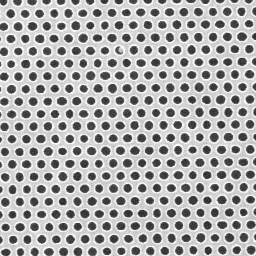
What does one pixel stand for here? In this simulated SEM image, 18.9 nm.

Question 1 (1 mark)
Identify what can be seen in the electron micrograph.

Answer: a regular array of holes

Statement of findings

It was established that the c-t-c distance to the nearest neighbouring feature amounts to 266 nm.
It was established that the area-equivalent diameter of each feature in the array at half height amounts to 174 nm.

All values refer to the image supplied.